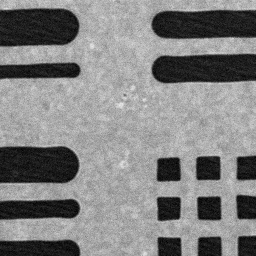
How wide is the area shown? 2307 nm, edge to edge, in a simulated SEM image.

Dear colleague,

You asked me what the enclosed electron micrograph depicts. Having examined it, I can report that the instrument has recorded groups of lines, slits or small figures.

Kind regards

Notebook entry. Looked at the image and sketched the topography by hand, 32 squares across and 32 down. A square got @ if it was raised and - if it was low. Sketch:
@@@@@@@@@@@@@@@@@@@@@@@@@@@@@@@@
---------@@@@@@@@@@@------------
----------@@@@@@@@@-------------
----------@@@@@@@@@-------------
----------@@@@@@@@@@------------
--------@@@@@@@@@@@@@@@@@@@@@@@@
@@@@@@@@@@@@@@@@@@@@@@@@@@@@@@@@
@@@@@@@@@@@@@@@@@@@-------------
----------@@@@@@@@@-------------
----------@@@@@@@@@-------------
@@@@@@@@@@@@@@@@@@@@@-@@@@@@@@@@
@@@@@@@@@@@@@@@@@@@@@@@@@@@@@@@@
@@@@@@@@@@@@@@@@@@@@@@@@@@@@@@@@
@@@@@@@@@@@@@@@@@@@@@@@@@@@@@@@@
@@@@@@@@@@@@@@@@@@@@@@@@@@@@@@@@
@@@@@@@@@@@@@@@@@@@@@@@@@@@@@@@@
@@@@@@@@@@@@@@@@@@@@@@@@@@@@@@@@
@@@@@@@@@@@@@@@@@@@@@@@@@@@@@@@@
---------@@@@@@@@@@@@@@@@@@@@@@@
----------@@@@@@@@@@@@@@@--@@@--
----------@@@@@@@@@@---@----@@--
----------@@@@@@@@@@---@----@@--
---------@@@@@@@@@@@--@@@--@@@--
@@@@@@@@@@@@@@@@@@@@@@@@@@@@@@@@
@@@@@@@@@@@@@@@@@@@@@@@@@--@@@--
----------@@@@@@@@@@---@----@@--
----------@@@@@@@@@@---@@---@@--
-----@@@@@@@@@@@@@@@--@@@--@@@--
@@@@@@@@@@@@@@@@@@@@@@@@@@@@@@@@
@@@@@@@@@@@@@@@@@@@@@@@@@@@@@@--
----------@@@@@@@@@@---@@---@@--
----------@@@@@@@@@@---@@---@@--